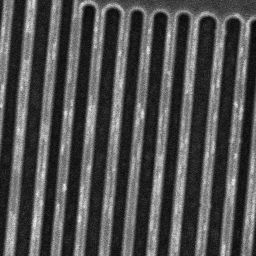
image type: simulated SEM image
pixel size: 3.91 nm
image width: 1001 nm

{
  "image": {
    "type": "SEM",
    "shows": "parallel lines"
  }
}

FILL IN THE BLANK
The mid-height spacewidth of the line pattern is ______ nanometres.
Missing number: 55.6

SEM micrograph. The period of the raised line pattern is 93.4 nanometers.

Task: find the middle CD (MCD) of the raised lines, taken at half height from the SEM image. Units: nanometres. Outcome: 35.1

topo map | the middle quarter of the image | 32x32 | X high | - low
-XX----XX----XX----XX----XX----X
-XX----XX----XX----XX----XX----X
-XX----XX----XX----XX----XX---XX
-XX----XX----XX----XX----XX---XX
-XX----XX----XX----XX----XX---XX
XXX----XX----XX----XX----XX---XX
XXX---XX-----XX---XXX----XX---XX
XXX---XX-----XX---XX----XX----XX
XX----XX----XXX---XX----XX----XX
XX----XX----XX----XX----XX----XX
XX----XX----XX----XX----XX----XX
XX----XX----XX----XX----XX----XX
XX----XX----XX----XX----XX----XX
XX----XX----XX----XX----XX---XX-
XX----XX----XX----XX----XX---XX-
XX----X-----XX----XX----XX---XX-
XX----X-----XX----XX----XX---XX-
XX---XX-----XX---XXX----XX---XX-
XX---XX-----XX---XX----XX----XX-
XX---XX-----XX---XX----XX----XX-
X----XX----XX----XX----XX----XX-
X----XX----XX----XX----XX----XX-
X----XX----XX----XX----XX----XX-
X----XX----XX----XX----XX----XX-
X----XX----XX----XX----XX---XXX-
X---XXX----XX----XX----XX---XX--
X---XXX----XX----XX----XX---XX--
X---XXX----XX----XX----XX---XX--
X---XX-----XX---XXX----XX---XX--
X---XX-----XX---XX----XX----XX--
X---XX-----XX---XX----XX----XX--
----XX----XX----XX----XX----XX--